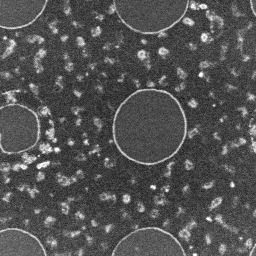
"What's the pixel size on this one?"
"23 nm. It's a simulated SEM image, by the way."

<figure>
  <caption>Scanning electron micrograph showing raised bodies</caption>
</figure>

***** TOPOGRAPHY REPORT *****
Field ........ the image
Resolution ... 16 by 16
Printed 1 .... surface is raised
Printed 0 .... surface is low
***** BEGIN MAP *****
1110000111110000
1100000011100000
0000000000000000
0000000000000000
0000000000000000
0000000000000000
0000000011100000
1100000111110000
1100000111110000
0000000011100000
0000000000000000
0000000000000000
0000000000000000
0000000000000000
1100000011000000
1110000111100000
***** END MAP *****